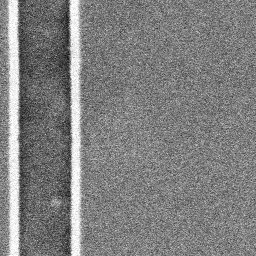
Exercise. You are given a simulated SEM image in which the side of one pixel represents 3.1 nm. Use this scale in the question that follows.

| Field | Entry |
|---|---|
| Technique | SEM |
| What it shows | one or a few lines or trenches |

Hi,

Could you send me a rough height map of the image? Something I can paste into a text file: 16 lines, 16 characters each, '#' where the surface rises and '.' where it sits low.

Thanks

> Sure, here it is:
#....###########
#....###########
#....###########
#....###########
#....###########
#....###########
#....###########
#....###########
#....###########
#....###########
#....###########
#....###########
#....###########
#....###########
#....###########
#....###########